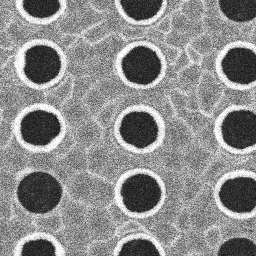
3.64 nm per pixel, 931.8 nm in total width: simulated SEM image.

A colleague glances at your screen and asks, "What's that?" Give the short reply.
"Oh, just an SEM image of holes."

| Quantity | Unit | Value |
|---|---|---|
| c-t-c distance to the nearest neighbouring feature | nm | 232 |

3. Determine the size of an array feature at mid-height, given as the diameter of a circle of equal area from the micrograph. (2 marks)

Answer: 0.141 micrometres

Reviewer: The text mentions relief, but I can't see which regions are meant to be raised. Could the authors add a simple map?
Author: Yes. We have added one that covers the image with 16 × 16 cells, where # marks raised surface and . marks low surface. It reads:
##..####..####..
################
################
##..####..####..
##..####..####..
################
################
#...####..####..
#..#####..####..
################
################
#...####..####..
#...####..####..
################
################
#..#####..####..